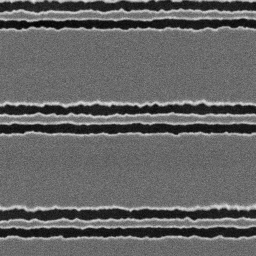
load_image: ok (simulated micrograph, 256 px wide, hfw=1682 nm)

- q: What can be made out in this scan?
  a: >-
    lines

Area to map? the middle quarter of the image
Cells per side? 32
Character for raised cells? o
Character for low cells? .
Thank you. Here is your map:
oooooooooooooooooooooooooooooooo
oooooooooooooooooooooooooooooooo
oooooooooooooooooooooooooooooooo
oooooooooooooooooooooooooooooooo
oooooooooooooooooooooooooooooooo
oooooooooooooooooooooooooooooooo
oooooooooooooooooooooooooooooooo
oooooooooooooooooooooooooooooooo
oooooooooooooooooooooooooooooooo
oooooooooooooooooooooooooooooooo
o.................oo............
................................
.o..................o.....oo....
oooooooooooooooooooooooooooooooo
oooooooooooooooooooooooooooooooo
................................
................................
ooo...ooooo..oooooooooooooo..ooo
oooooooooooooooooooooooooooooooo
oooooooooooooooooooooooooooooooo
oooooooooooooooooooooooooooooooo
oooooooooooooooooooooooooooooooo
oooooooooooooooooooooooooooooooo
oooooooooooooooooooooooooooooooo
oooooooooooooooooooooooooooooooo
oooooooooooooooooooooooooooooooo
oooooooooooooooooooooooooooooooo
oooooooooooooooooooooooooooooooo
oooooooooooooooooooooooooooooooo
oooooooooooooooooooooooooooooooo
oooooooooooooooooooooooooooooooo
oooooooooooooooooooooooooooooooo